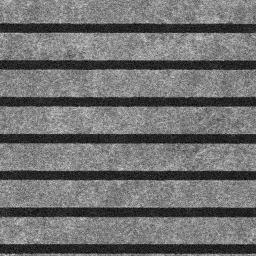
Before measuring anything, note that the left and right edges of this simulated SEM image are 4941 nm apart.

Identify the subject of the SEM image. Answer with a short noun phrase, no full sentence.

parallel lines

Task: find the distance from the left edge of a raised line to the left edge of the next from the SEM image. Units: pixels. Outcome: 36.7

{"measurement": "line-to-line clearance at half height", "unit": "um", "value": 0.198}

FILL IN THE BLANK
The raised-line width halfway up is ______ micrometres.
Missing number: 0.514